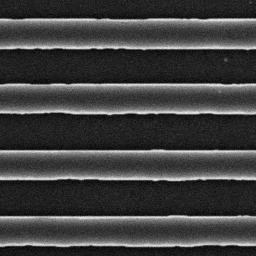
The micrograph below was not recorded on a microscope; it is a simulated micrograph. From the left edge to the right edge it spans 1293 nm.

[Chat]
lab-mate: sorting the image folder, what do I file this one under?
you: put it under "lines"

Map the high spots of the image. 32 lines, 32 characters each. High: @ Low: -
--------------------------------
--------------------------------
----@@-@@@@@------@@@@@-@--@@@@@
@@@@@@@@@@@@@@@@@@@@@@@@@@@@@@@@
@@@@@@@@@@@@@@@@@@@@@@@@@@@@@@@@
@@@@@@@@@@@@@@@@@@@@@@@@@@@@@@@@
--------------------------------
--------------------------------
--------------------------------
--------------------------------
--------------------------------
@@@@@@@@@@@@@@@@@@@@@@@@@@@@@@@@
@@@@@@@@@@@@@@@@@@@@@@@@@@@@@@@@
@@@@@@@@@@@@@@@@@@@@@@@@@@@@@@@@
--------------------------------
--------------------------------
--------------------------------
--------------------------------
--------------------------------
@@@@@@@@@@@@@@@@@@@@@@@@@@@@@@@@
@@@@@@@@@@@@@@@@@@@@@@@@@@@@@@@@
@@@@@@@@@@@@@@@@@@@@@@@@@@@@@@@@
-------------------@-@@---------
--------------------------------
--------------------------------
--------------------------------
--------------------------------
@@@@@@@@@@@@@@@@@@@@@@@@@@@@@@@@
@@@@@@@@@@@@@@@@@@@@@@@@@@@@@@@@
@@@@@@@@@@@@@@@@@@@@@@@@@@@@@@@@
@@@@@@@@@@@@@@@@@@@@@@@@@@@@@@@@
--------------------------------